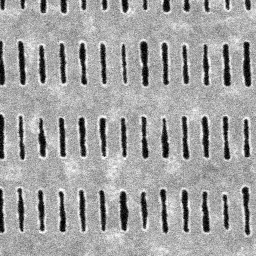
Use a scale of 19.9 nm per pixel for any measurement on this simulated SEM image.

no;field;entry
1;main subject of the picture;a regular array of holes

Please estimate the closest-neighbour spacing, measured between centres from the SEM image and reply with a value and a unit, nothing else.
0.407 microns